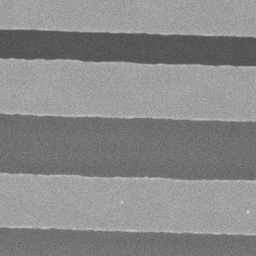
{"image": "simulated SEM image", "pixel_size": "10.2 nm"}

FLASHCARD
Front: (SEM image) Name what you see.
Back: lines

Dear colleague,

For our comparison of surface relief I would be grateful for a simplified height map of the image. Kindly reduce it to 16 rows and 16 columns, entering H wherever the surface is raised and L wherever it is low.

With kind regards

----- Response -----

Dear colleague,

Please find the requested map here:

HHHHHHHHHHHHHHHH
HHHHHHHHHHHHHHHH
LLLLLLLLLLLLLLLL
LLLLLLLLLLLLLLLL
HHHHHHHHHHHHHHHH
HHHHHHHHHHHHHHHH
HHHHHHHHHHHHHHHH
LLLLLLLLLLLLLHHH
LLLLLLLLLLLLLLLL
LLLLLLLLLLLLLLLL
LLLLLLLLLLLLLLLL
HHHHHHHHHHHHHHHH
HHHHHHHHHHHHHHHH
HHHHHHHHHHHHHHHH
LLLLLLLLLHHHHHHH
LLLLLLLLLLLLLLLL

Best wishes